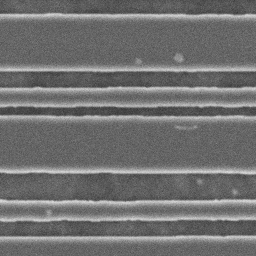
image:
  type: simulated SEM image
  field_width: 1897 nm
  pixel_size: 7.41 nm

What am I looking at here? lines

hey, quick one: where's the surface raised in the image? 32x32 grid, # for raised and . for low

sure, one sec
................................
................................
################################
################################
################################
################################
################################
################################
################################
................................
................................
################################
################################
................................
................................
################################
################################
################################
################################
################################
################################
.###..#####...##########.##.####
................................
................................
................................
################################
################################
##..###....##...................
................................
................................
################################
################################